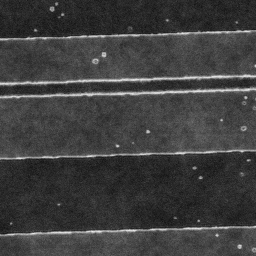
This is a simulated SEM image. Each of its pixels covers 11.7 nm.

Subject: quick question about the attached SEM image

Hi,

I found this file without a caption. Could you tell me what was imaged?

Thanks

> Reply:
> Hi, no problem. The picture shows lines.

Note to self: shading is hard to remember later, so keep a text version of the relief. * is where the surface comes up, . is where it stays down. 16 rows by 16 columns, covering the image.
................
................
****************
****************
****************
****************
****************
****************
****************
*************...
................
................
................
................
.....***********
****************